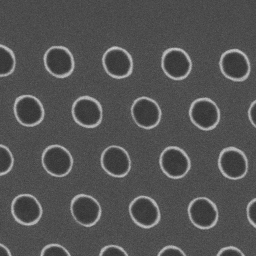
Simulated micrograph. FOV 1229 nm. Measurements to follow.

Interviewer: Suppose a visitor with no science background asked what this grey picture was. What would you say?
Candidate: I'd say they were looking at a regular array of raised bodies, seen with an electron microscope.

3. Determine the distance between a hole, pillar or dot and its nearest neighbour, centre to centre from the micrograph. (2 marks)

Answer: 275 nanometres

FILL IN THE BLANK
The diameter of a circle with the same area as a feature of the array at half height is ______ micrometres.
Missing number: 0.142